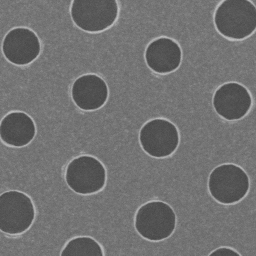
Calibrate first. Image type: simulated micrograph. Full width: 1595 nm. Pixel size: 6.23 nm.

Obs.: a regular array of holes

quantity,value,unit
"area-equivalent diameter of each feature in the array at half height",237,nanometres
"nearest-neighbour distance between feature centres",512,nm